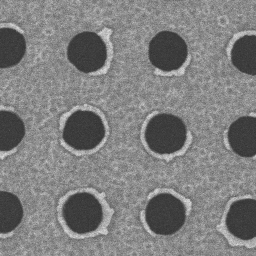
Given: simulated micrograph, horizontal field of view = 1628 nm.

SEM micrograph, holes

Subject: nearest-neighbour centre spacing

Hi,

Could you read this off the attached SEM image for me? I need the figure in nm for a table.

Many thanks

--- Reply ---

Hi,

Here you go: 511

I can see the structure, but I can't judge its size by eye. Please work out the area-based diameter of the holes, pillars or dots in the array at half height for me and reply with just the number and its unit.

258 nm